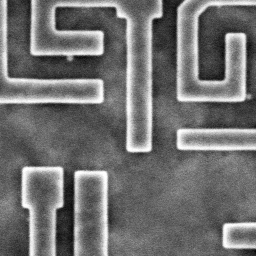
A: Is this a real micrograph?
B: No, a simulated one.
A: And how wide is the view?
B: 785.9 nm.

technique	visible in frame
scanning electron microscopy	wiring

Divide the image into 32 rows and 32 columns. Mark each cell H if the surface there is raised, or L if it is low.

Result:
HLLLHHHHHHHHHHHHHHHHLLLHHHHHHHHH
HLLLHHHLLLLLLLLHHHHHLLHHHLLLLLLL
HLLLHHHLLLLLLLLLHHHLLLHHHLLLLLLL
HLLLHHHLLLLLLLLLHHHLLLHHHLLLLLLL
HLLLHHHHHHHHHLLLHHHLLLHHHLLLHHHL
HLLLHHHHHHHHHLLLHHHLLLHHHLLLHHHL
HLLLHHHHHHHHHLLLHHHLLLHHHLLLHHHL
HLLLLLLLLLLLLLLLHHHLLLHHHLLLHHHL
HLLLLLLLLLLLLLLLHHHLLLHHHLLLHHHL
HLLLLLLLLLLLLLLLHHHLLLHHHLLLHHHL
HHHHHHHHHHHHHLLLHHHLLLHHHHHHHHHL
HHHHHHHHHHHHHLLLHHHLLLHHHHHHHHHL
HHHHHHHHHHHHHLLLHHHLLLHHHHHHHHLL
LLLLLLLLLLLLLLLLHHHLLLLLLLLLLLLL
LLLLLLLLLLLLLLLLHHHLLLLLLLLLLLLL
LLLLLLLLLLLLLLLLHHHLLLLLLLLLLLLL
LLLLLLLLLLLLLLLLHHHLLLHHHHHHHHHH
LLLLLLLLLLLLLLLLHHHLLLHHHHHHHHHH
LLLLLLLLLLLLLLLLHHHLLLHHHHHHHHHH
LLLLLLLLLLLLLLLLLLLLLLLLLLLLLLLL
LLLLLLLLLLLLLLLLLLLLLLLLLLLLLLLL
LLLHHHHHLLHHHLLLLLLLLLLLLLLLLLLL
LLLHHHHHLHHHHLLLLLLLLLLLLLLLLLLL
LLLHHHHHLHHHHLLLLLLLLLLLLLLLLLLL
LLLHHHHHLHHHHLLLLLLLLLLLLLLLLLLL
LLLHHHHHLHHHHLLLLLLLLLLLLLLLLLLL
LLLLHHHLLHHHHLLLLLLLLLLLLLLLLLLL
LLLLHHHLLHHHHLLLLLLLLLLLLLLLLLLL
LLLLHHHLLHHHHLLLLLLLLLLLLLLLHHHH
LLLLHHHLLHHHHLLLLLLLLLLLLLLLHHHH
LLLLHHHLLHHHHLLLLLLLLLLLLLLLHHHH
LLLLHHHLLHHHHLLLLLLLLLLLLLLLLLLL